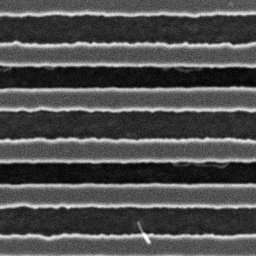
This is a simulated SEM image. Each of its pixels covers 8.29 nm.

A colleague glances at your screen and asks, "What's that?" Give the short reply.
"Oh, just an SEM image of lines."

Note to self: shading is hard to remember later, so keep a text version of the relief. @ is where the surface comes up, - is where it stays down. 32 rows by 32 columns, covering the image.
@@@@@@@@@@@@@@@@@@@@@@@@@@@@@@@@
@@@@@@@@@@@@@@@@@@@@@@@@@@@@@@@@
--------------------------------
--------------------------------
--------------------------------
@@@@@--@@@@@@@@@@@@@@-@@-@-@@--@
@@@@@@@@@@@@@@@@@@@@@@@@@@@@@@@@
@@@@@@@@@@@@@@@@@@@@@@@@@@@@@@@@
--------------------------------
--------------------------------
--------------------------------
@@@@@@@@@@@@@@@@@@@@@@@@@@@@@@@@
@@@@@@@@@@@@@@@@@@@@@@@@@@@@@@@@
@@@@@@@@@@@@@@@@@@@@@@@@@@@@@@@@
--------------------------------
--------------------------------
--------------------------------
@-@@@@-@@@@@@@-@--@@@@@@@@@@@@--
@@@@@@@@@@@@@@@@@@@@@@@@@@@@@@@@
@@@@@@@@@@@@@@@@@@@@@@@@@@@@@@@@
--------------------------------
--------------------------------
--------------------------------
@@@@@@@@@@@@@@@@@@@@@@@@@@@@@@@@
@@@@@@@@@@@@@@@@@@@@@@@@@@@@@@@@
@@@@@@@@@@@@@@@@@@@@@@@@@@@@@@@@
--------------------------------
--------------------------------
--------------------------------
@@@@@@-@@@@@@@@@@@@@@@@@@@@@@@@@
@@@@@@@@@@@@@@@@@@@@@@@@@@@@@@@@
@@@@@@@@@@@@@@@@@@@@@@@@@@@@@@@@